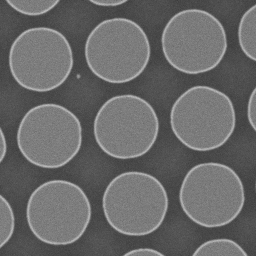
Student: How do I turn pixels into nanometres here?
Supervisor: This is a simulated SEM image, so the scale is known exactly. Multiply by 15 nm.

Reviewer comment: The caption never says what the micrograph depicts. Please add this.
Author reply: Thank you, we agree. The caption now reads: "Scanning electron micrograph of an array of small figures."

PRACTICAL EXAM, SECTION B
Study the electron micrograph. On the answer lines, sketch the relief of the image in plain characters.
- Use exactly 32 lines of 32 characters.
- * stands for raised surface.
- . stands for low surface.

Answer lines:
.******.....***.................
...***.................***.....*
..............**.....******...**
............*****....*******..**
..******...*******..********..**
..*******..********.********..**
.********..********.********...*
.********..********..*******....
.********..*******....****......
..******....*****...............
...*****........................
.......................****.....
..............****....*******..*
....****.....******...*******..*
...******...*******..********..*
...*******..********.********..*
..********..********..*******...
*.********..*******....*****....
*.********...******.....***.....
...******.....***...............
....****..................*.....
........................*****...
..............******...*******..
.....*****...*******...*******..
....*******..********..*******..
*...*******..********..*******..
*..********..********..*******..
**..*******..*******....*****...
**..*******...******............
*....*****......................
.......*.................*****..
................****....******..